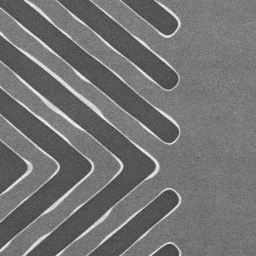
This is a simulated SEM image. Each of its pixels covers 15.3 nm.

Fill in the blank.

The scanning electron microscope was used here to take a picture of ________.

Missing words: groups of lines, slits or small figures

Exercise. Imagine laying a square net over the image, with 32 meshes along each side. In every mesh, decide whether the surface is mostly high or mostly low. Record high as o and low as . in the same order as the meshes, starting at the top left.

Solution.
....oooo....oooo....oooooooooooo
o....oooo....oooo....ooooooooooo
oo....oooo....oooo....oooooooooo
ooo....oooo....oooo...oooooooooo
oooo....oooo.....ooooooooooooooo
.oooo.....ooo.....oooooooooooooo
...oooo....oooo....ooooooooooooo
....oooo....oooo....oooooooooooo
o.....ooo....oooo....ooooooooooo
oo.....ooo.....ooo....oooooooooo
ooo.....oooo....oooo..oooooooooo
.ooo.....oooo....ooooooooooooooo
..oooo....oooo....oooooooooooooo
...oooo.....ooo....ooooooooooooo
....oooo.....ooo.....ooooooooooo
o.....ooo.....oooo....oooooooooo
ooo....oooo....oooo...oooooooooo
oooo....oooo....oooo..oooooooooo
.oooo....oooo....ooooooooooooooo
..oooo....oooo.....ooooooooooooo
....ooo....oooo.....oooooooooooo
...oooo....oooo....ooooooooooooo
..oooo....oooo....oooooooooooooo
.oooo....oooo....ooooooooooooooo
oooo....oooo....oooo..oooooooooo
ooo....ooo....ooooo...oooooooooo
o.....ooo.....ooo....ooooooooooo
....oooo.....ooo....oooooooooooo
...oooo....oooo....ooooooooooooo
..oooo....oooo....oooooooooooooo
.ooo.....oooo....oooo.oooooooooo
ooo.....ooo.....ooo...oooooooooo